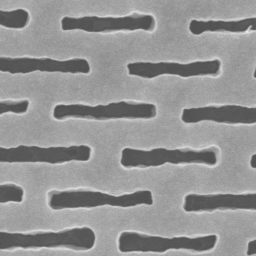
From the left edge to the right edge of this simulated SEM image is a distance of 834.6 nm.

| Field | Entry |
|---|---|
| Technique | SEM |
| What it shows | holes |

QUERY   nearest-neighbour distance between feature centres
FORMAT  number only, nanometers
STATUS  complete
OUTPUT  253